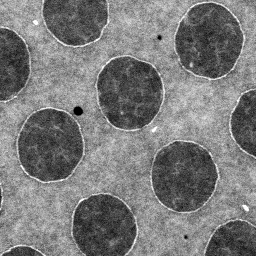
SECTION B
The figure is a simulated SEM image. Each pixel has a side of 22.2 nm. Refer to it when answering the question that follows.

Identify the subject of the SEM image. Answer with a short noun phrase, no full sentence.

raised bodies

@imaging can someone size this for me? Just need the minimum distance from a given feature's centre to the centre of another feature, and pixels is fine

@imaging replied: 95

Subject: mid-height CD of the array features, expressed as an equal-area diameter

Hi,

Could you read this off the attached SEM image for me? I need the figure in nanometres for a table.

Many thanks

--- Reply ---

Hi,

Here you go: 1570